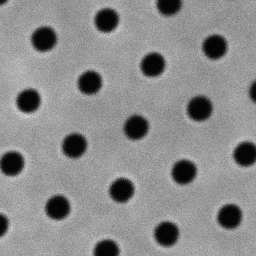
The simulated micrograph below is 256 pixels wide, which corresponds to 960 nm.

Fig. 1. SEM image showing a regular array of holes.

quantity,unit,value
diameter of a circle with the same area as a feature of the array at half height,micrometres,0.0965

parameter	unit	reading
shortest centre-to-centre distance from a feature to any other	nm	239